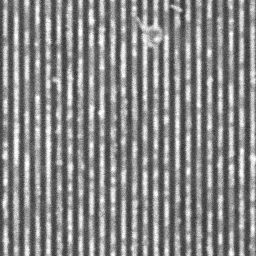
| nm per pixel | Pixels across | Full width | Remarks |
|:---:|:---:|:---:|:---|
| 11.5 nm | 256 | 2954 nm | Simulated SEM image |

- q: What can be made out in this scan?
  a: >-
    parallel lines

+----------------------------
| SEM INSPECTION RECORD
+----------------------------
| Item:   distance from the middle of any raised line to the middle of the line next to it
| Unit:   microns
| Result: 0.124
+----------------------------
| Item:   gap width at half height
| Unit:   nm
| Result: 86.5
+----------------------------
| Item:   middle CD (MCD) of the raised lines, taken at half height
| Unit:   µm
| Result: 0.0382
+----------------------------